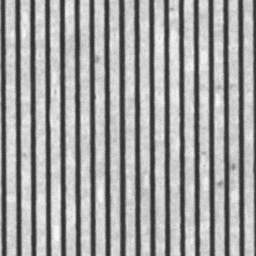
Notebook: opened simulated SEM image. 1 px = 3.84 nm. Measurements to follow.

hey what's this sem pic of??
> parallel lines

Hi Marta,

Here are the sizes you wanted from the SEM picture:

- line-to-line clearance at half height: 20.2 nm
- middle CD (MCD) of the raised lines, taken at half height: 37 nanometers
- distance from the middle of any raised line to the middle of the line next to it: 14.9 px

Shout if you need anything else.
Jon